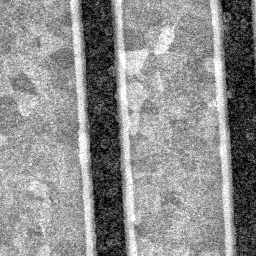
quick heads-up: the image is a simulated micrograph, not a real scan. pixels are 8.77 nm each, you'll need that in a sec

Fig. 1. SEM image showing one or a few lines or trenches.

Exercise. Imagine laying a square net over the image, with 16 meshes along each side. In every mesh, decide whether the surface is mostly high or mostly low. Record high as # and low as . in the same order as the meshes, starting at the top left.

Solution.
#####..######...
#####..#######..
#####...######..
#####...######..
#####...######..
#####...######..
#####...######..
#####...######..
#####...######..
#####...######..
#####...######..
#####...######..
#####...######..
#####...######..
######..######..
######..######..